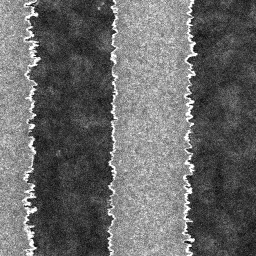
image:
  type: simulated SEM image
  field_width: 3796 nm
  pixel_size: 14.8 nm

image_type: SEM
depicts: one or a few lines or trenches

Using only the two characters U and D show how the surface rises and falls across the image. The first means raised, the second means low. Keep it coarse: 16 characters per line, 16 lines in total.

UUDDDDDUUUUUDDDD
UUDDDDDUUUUUDDDD
UUDDDDDUUUUUDDDD
UUDDDDDUUUUUDDDD
UUDDDDDUUUUUDDDD
UUDDDDDUUUUUDDDD
UUDDDDDUUUUUDDDD
UUDDDDDUUUUUDDDD
UUDDDDDUUUUUDDDD
UUDDDDDUUUUUDDDD
UUDDDDDUUUUUDDDD
UUDDDDDUUUUUDDDD
UUDDDDDUUUUUDDDD
UUDDDDDUUUUUDDDD
UUDDDDDUUUUUDDDD
UUDDDDDUUUUUDDDD